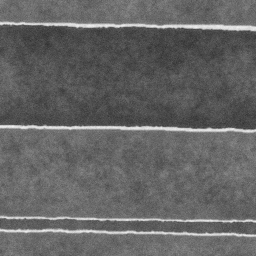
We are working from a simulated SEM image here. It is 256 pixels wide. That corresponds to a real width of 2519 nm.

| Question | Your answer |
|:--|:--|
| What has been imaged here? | lines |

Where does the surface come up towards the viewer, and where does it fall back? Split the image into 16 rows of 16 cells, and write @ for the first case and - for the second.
@@@@@@@@@@@@@@@@
--@@@@@@@@@@@@@@
----------------
----------------
----------------
----------------
----------------
----------------
@@@@@@@@@@@@@@@@
@@@@@@@@@@@@@@@@
@@@@@@@@@@@@@@@@
@@@@@@@@@@@@@@@@
@@@@@@@@@@@@@@@@
@@@@@@@@@@@@@@@@
@@@@@@@@@@@@@@@@
@@@@@@@@@@@@@@@@